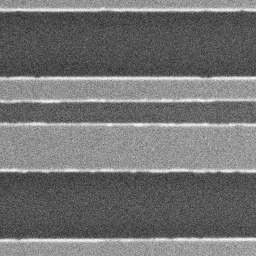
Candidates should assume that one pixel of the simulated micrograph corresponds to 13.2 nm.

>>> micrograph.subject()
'lines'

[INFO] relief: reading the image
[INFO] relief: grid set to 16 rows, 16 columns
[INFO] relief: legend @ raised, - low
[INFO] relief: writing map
@@@@@@@@@@@@@@@@
----------------
----------------
----------------
----------------
@@@@@@@@@@@@@@@@
@@@@@@@@@@@@@@@@
@@@@@@@@@@@@@@@@
@@@@@@@@@@@@@@@@
@@@@@@@@@@@@@@@@
@@@@@@@@@@@@@@@@
----------------
----------------
----------------
----------------
@@@@@@@@@@@@@@@@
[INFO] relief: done